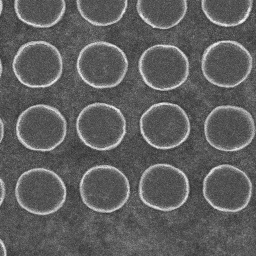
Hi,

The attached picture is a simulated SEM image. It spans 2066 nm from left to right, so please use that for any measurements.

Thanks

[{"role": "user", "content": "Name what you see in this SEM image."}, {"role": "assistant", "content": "a regular array of raised bodies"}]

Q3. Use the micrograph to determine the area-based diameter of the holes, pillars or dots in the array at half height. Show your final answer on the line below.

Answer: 46.4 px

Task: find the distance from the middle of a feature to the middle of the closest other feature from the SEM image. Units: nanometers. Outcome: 484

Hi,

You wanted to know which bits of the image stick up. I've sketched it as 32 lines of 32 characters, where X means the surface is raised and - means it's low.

--XXXXXX--XXXXXX-XXXXXX--XXXXXX-
--XXXXXX--XXXXX--XXXXXX---XXXXX-
---XXXX----XXXX---XXXXX---XXXXX-
--------------------X-----------
--------------------------------
----XX------X--------------XXX--
--XXXXX---XXXXX---XXXXX---XXXXX-
--XXXXXX--XXXXXX--XXXXX---XXXXX-
--XXXXXX--XXXXXX--XXXXX--XXXXXX-
--XXXXX---XXXXX---XXXXX---XXXXX-
---XXX-----XXX-----XXXX----XXX--
--------------------------------
--------------------------------
----XX-----XXX-----XXX-----XX---
---XXXXX--XXXXX---XXXXX---XXXXX-
--XXXXXX--XXXXXX--XXXXXX--XXXXX-
--XXXXXX--XXXXXX--XXXXXX--XXXXXX
---XXXXX--XXXXX---XXXXX---XXXXX-
----XXX-----X-------X------XXX--
--------------------------------
--------------------------------
----XX-----XXXX---XXXXX---XXXX--
--XXXXX---XXXXXX--XXXXX---XXXXX-
--XXXXXX--XXXXXX--XXXXXX--XXXXX-
--XXXXXX--XXXXXX--XXXXX---XXXXX-
---XXXXX---XXXX----XXXX---XXXXX-
----XX--------------------------
--------------------------------
--------------------------------
--------------------------------
--------------------------------
X-------------------------------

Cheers